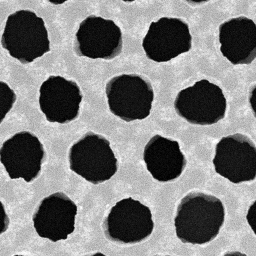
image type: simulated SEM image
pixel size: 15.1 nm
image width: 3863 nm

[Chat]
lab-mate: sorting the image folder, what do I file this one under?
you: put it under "a regular array of holes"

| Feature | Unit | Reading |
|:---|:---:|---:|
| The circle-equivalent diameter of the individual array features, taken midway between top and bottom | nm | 691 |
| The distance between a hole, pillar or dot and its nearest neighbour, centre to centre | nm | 1040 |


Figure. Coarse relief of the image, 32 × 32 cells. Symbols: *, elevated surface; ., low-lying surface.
********************************
**..****************************
*....*****....******..*******..*
*.....****.....****.....****....
......****.....***......***.....
......****.....***......***.....
*.....****.....***.....*****....
**..***************..********...
********************************
******.********..***************
.****....****.....******...*****
..***.....***......****.....****
..***.....****.....***......***.
.****.....****.....***......****
.*****...******...*****.....****
*************************..*****
********************************
*....*****...******..*******...*
.....****.....****....*****.....
.....****.....****.....****.....
.....****......***.....****.....
*....****.....*****....****.....
***.*******..*******.********..*
********************************
******..***************...******
*****....*****....*****.....****
.****.....****.....***......***.
.***.....****......***......***.
.***.....****......***.....****.
*****...******....****.....*****
************************.*******
********************************